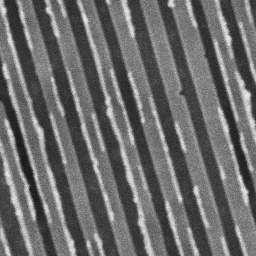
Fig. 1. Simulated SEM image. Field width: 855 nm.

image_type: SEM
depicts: parallel lines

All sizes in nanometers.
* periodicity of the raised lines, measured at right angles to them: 99.2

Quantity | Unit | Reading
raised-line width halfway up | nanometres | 55.7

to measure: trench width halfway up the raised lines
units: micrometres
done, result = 0.0437